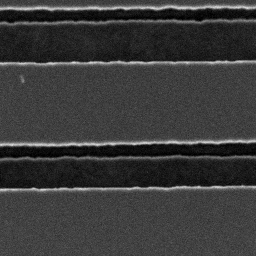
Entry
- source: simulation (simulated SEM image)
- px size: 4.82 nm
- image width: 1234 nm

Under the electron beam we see lines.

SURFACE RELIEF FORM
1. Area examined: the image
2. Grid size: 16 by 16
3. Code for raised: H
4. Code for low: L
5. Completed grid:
HHHHHHHHHHLHHLLL
LLLLLLLLLLLLLLLL
LLLLLLLLLLLLLLLL
LLLLLLLLLLLLLLLL
HHHHHHHHHHHHHHHH
HHHHHHHHHHHHHHHH
HHHHHHHHHHHHHHHH
HHHHHHHHHHHHHHHH
HHHHHHHHHHHHHHHH
LLLLLLLLLLLLLLLL
LLLLLLLLLLLLLLLL
LLLLLLLLLLLLLLLL
HHHHHHHHHHHHHHHH
HHHHHHHHHHHHHHHH
HHHHHHHHHHHHHHHH
HHHHHHHHHHHHHHHH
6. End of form